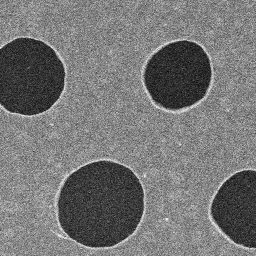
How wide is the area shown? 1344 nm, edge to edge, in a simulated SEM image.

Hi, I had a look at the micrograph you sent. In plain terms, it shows holes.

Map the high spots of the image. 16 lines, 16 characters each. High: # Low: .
################
################
#.##############
....######...###
....#####....###
....#####....###
...#######..####
################
################
################
#####...########
####.....#####..
####.....####...
####.....####...
####....######..
################